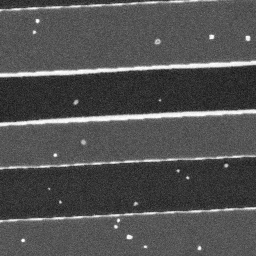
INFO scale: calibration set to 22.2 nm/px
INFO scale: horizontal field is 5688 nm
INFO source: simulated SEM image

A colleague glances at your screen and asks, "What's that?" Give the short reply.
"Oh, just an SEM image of lines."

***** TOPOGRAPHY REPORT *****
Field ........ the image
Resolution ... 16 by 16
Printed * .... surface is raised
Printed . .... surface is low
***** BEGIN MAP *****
...*************
****************
****************
****************
***.............
................
................
.....***********
****************
****************
................
................
................
......**********
****************
****************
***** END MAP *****